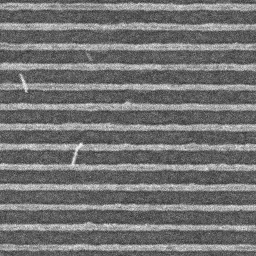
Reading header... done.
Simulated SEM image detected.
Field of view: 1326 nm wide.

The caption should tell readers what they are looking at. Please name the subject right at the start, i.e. parallel lines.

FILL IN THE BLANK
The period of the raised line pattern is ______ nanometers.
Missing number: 104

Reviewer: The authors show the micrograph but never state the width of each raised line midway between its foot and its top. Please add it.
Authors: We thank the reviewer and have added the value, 25.3 nanometres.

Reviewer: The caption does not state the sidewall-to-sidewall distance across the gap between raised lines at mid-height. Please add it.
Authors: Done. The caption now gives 81.6 nanometers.